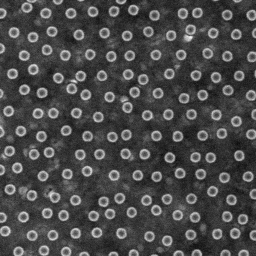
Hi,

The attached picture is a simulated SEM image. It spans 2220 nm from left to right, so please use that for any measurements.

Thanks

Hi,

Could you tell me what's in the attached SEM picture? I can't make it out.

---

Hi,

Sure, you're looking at a regular array of raised bodies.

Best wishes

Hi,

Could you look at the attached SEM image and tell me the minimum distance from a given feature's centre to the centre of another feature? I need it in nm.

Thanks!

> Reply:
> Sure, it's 161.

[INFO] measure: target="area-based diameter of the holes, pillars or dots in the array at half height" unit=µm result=0.0875